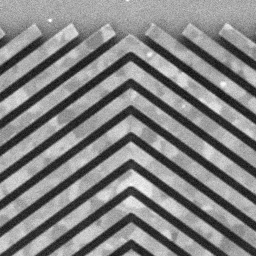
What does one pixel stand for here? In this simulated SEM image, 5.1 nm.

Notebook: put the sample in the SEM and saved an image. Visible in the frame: groups of lines, slits or small figures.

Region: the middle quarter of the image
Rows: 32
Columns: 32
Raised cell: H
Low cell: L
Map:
HHLLLLHHHHHLLLLHHHLLLLHHHHHLLLLH
HLLLHHHHHHLLLHHHHHHHLLLLHHHHHLLL
LLLHHHHHLLLLHHHHHHHHHLLLLHHHHHLL
LLHHHHHLLLLHHHHHHHHHHHLLLLHHHHHH
LHHHHHLLLLHHHHHLLLHHHHHHLLLHHHHH
HHHHHLLLHHHHHHLLLLLLHHHHHLLLLHHH
HHHLLLLHHHHHLLLLHLLLLHHHHHHLLLLH
HHLLLHHHHHHLLLLHHHHLLLHHHHHHLLLL
LLLLHHHHHHLLLHHHHHHHLLLLHHHHHLLL
LLLHHHHHLLLLHHHHHHHHHLLLLHHHHHHL
LHHHHHHLLLLHHHHHLHHHHHHLLLLHHHHH
HHHHHLLLLHHHHHHLLLLHHHHHLLLLHHHH
HHHHLLLLHHHHHLLLLLLLHHHHHHLLLHHH
HHHLLLHHHHHHLLLLHHLLLHHHHHHLLLLH
HHLLLHHHHHHLLLHHHHHLLLLHHHHHLLLL
LLLLHHHHHLLLLHHHHHHHHLLLHHHHHHLL
LLHHHHHHLLLHHHHHHHHHHHLLLLHHHHHL
LHHHHHLLLLHHHHHHLLHHHHHLLLLHHHHH
HHHHHLLLLHHHHHLLLLLHHHHHHLLLHHHH
HHHHLLLHHHHHHLLLLLLLLHHHHHLLLLHH
HHLLLLHHHHHLLLLHHHLLLLHHHHHHLLLH
HLLLLHHHHHLLLLHHHHHHLLLHHHHHHLLL
LLLHHHHHHLLLHHHHHHHHHLLLLHHHHHLL
LLHHHHHLLLLHHHHHHHHHHHLLLLHHHHHH
LHHHHHLLLLHHHHHLLLHHHHHHLLLHHHHH
HHHHHLLLHHHHHHLLLLLLHHHHHLLLLHHH
HHHLLLLHHHHHLLLLHLLLLHHHHHHLLLHH
HHLLLLHHHHHLLLLHHHHLLLHHHHHHLLLL
HLLLHHHHHHLLLLHHHHHHLLLLHHHHHLLL
LLLHHHHHHLLLHHHHHHHHHLLLLHHHHHHL
LLHHHHHLLLLHHHHHLHHHHHHLLLLHHHHH
HHHHHHLLLHHHHHHLLLLHHHHHLLLLHHHH